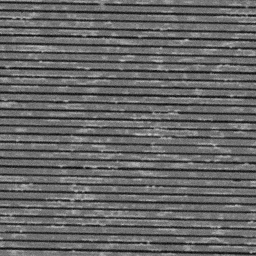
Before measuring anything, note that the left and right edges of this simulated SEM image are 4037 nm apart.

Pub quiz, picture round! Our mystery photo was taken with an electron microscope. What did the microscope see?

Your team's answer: parallel lines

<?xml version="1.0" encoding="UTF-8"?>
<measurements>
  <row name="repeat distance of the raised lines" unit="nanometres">129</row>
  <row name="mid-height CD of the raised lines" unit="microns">0.0887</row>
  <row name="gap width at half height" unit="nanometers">45.3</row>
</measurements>